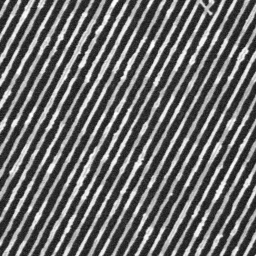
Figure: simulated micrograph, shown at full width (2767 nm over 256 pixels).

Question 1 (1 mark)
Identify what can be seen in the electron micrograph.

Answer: parallel lines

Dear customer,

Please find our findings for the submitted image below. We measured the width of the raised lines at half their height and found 0.0299 µm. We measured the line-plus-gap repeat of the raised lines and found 114 nm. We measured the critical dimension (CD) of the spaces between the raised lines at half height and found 78.9 nm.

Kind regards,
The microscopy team